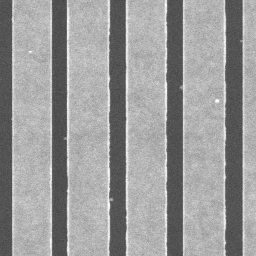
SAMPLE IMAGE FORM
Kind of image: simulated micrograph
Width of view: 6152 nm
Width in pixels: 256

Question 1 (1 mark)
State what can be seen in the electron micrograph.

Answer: lines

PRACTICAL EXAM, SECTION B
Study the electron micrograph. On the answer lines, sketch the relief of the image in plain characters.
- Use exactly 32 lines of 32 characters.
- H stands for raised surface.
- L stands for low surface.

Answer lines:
LLHHHHLLHHHHHHLLHHHHHLLHHHHHLLHH
LLHHHHLLHHHHHHLLHHHHHLLHHHHHLLHH
LLHHHHLLHHHHHHLLHHHHHLLHHHHHLLHH
LLHHHHLLHHHHHHLLHHHHHLLHHHHHLLHH
LLHHHHLLHHHHHHLLHHHHHLLHHHHHLLHH
LLHHHHLLHHHHHHLLHHHHHLLHHHHHLLHH
LLHHHHLLHHHHHHLLHHHHHLLHHHHHLLHH
LLHHHHLLHHHHHHLLHHHHHLLHHHHHLLHH
LLHHHHLLHHHHHHLLHHHHHLLHHHHHLLHH
LLHHHHLLHHHHHHLLHHHHHLLHHHHHLLHH
LLHHHHLLHHHHHHLLHHHHHLLHHHHHLLHH
LLHHHHLLHHHHHHLLHHHHHLLHHHHHLLHH
LLHHHHLLHHHHHHLLHHHHHLLHHHHHLLHH
LLHHHHLLHHHHHHLLHHHHHLLHHHHHLLHH
LLHHHHLLHHHHHHLLHHHHHLLHHHHHLLHH
LLHHHHLLHHHHHHLLHHHHHLLHHHHHLLHH
LLHHHHLLHHHHHHLLHHHHHLLHHHHHLLHH
LLHHHHLLHHHHHHLLHHHHHLLHHHHHLLHH
LLHHHHLLHHHHHHLLHHHHHLLHHHHHLLHH
LLHHHHLLHHHHHHLLHHHHHLLHHHHHLLHH
LLHHHHLLHHHHHHLLHHHHHLLHHHHHLLHH
LLHHHHLLHHHHHHLLHHHHHLLHHHHHLLHH
LLHHHHLLLHHHHHLLHHHHHLLHHHHHLLHH
LLHHHHLLHHHHHHLLHHHHHLLHHHHHLLHH
LLHHHHLLHHHHHHLLHHHHHLLHHHHHLLHH
LLHHHHLLHHHHHHLLHHHHHLLHHHHHLLHH
LLHHHHLLHHHHHHLLHHHHHLLHHHHHLLHH
LLHHHHLLHHHHHHLLHHHHHLLHHHHHLLHH
LLHHHHLLHHHHHHLLHHHHHLLHHHHHLLHH
LLHHHHLLHHHHHHLLHHHHHLLHHHHHLLHH
LLHHHHLLHHHHHHLLHHHHHLLHHHHHLLHH
LLHHHHLLHHHHHHLLHHHHHLLHHHHHLLHH